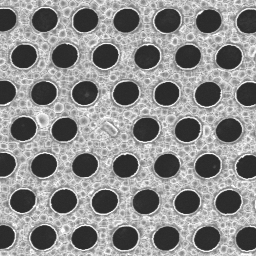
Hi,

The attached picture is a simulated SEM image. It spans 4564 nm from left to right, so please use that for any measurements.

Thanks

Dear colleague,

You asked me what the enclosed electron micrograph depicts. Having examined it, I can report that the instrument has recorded a regular array of holes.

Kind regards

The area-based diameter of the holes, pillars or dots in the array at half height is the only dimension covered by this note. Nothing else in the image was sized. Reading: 449 nm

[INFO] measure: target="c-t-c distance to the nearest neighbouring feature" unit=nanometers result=730